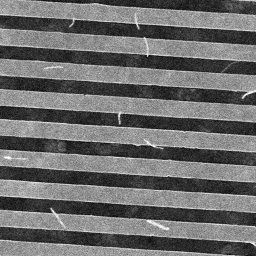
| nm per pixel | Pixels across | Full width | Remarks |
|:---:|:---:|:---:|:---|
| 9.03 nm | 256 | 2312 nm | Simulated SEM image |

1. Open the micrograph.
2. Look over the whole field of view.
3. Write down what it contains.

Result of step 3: parallel lines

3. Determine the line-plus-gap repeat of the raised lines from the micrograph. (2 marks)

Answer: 272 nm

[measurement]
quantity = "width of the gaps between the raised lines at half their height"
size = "125 nm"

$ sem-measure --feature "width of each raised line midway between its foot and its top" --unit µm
0.146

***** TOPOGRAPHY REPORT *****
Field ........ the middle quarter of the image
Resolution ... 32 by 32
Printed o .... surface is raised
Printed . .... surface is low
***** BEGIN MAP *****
ooooooooo.......................
ooooooooooooooooooooooooo.......
oooooooooooooooooooooooooooooooo
oooooooooooooooooooooooooooooooo
...........ooooooooooooooooooooo
..........................oooooo
................................
o...............................
oooooooooooooooo................
ooooooooooooooooooooooooooooooo.
oooooooooooooooooooooooooooooooo
...ooooooooooooooooooooooooooooo
..................oooooooooooooo
................................
................................
oooooooo........................
ooooooooooooooooooooooo.........
oooooooooooooooooooooooooooooooo
oooooooooooooooooooooooooooooooo
..........oooooooooooooooooooooo
......................o....ooooo
................................
................................
oooooooooooooo..................
oooooooooooooooooooooooooooooo..
oooooooooooooooooooooooooooooooo
...ooooooooooooooooooooooooooooo
................oooooooooooooooo
................................
................................
oooooo..........................
ooooooooooooooooooooo...........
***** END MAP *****